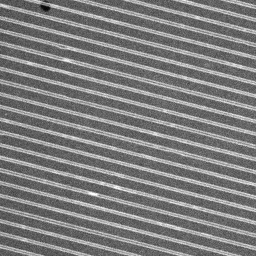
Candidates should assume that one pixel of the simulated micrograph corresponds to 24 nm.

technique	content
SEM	parallel lines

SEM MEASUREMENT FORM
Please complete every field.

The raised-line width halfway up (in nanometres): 75.4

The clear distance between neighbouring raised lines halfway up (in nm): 226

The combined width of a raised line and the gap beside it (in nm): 294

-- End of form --